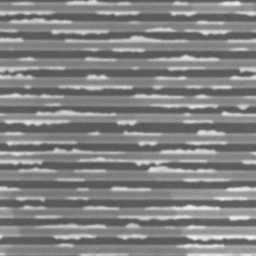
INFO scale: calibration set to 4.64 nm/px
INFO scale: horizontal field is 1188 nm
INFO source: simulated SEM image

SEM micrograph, parallel lines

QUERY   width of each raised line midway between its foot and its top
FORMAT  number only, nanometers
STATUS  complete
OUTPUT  51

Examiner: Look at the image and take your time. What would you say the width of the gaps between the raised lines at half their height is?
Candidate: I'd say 35.4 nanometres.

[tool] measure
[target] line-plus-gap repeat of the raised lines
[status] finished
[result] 86.3 nm